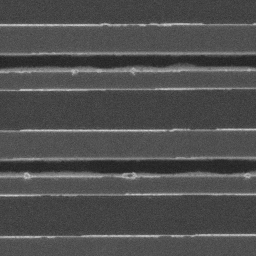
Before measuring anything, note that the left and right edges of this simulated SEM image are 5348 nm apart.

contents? lines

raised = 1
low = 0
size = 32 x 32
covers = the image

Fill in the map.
00000000000000000000000000000000
00000000000000000000000000000000
00000000000000000000000000000000
11111111111111111111111111111111
11111111111111111111111111111111
11111111111111111111111111111111
11111111111111111111111111111111
00000000000000000000000000000000
00000000000000000000000000000000
11111111111111111111111111111111
11111111111111111111111111111111
00000000000000000000000000000000
00000000000000000000000000000000
00000000000000000000000000000000
00000000000000000000000000000000
00000000000000000000000000000000
11111111111111111111111111111111
11111111111111111111111111111111
11111111111111111111111111111111
11111111111111111111111111111111
00000000000000000000000000000000
00000000000000000000000000000000
11111111111111111111111111111111
11111111111111111111111111111111
00000000000000000000000000000000
00000000000000000000000000000000
00000000000000000000000000000000
00000000000000000000000000000000
00000000000000000000000000000000
00000000000111011111111111111111
11111111111111111111111111111111
11111111111111111111111111111111